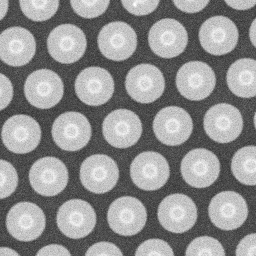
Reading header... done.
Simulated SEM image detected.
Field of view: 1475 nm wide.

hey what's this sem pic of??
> an array of small figures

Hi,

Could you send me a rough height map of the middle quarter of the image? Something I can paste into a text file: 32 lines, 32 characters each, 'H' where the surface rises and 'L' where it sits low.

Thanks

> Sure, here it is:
LLLLLLLLLLLLLLLLLLHHHHHLLLLLLLHH
LLLLLHHHHHLLLLLLLHHHHHHHLLLLLHHH
LLLLHHHHHHHHLLLLHHHHHHHHHLLLHHHH
LLLHHHHHHHHHLLLLHHHHHHHHHLLLHHHH
LLLHHHHHHHHHLLLHHHHHHHHHHLLLHHHH
LLLHHHHHHHHHLLLHHHHHHHHHHLLLHHHH
LLLHHHHHHHHHLLLLHHHHHHHHHLLLHHHH
LLLHHHHHHHHHLLLLHHHHHHHHLLLLLHHH
LLLLHHHHHHHHLLLLLHHHHHHHLLLLLLLH
LLLLLHHHHHHLLLLLLLHHHHLLLLLLLLLL
LLLLLLLLLLLLLLLLLLLLLLLLLLLLLLLL
LLLLLLLLLLLLLHHHLLLLLLLLHHHHHHLL
HHHHLLLLLLLHHHHHHHLLLLLHHHHHHHHL
HHHHHHLLLLHHHHHHHHHLLLLHHHHHHHHH
HHHHHHLLLLHHHHHHHHHLLLHHHHHHHHHH
HHHHHHHLLLHHHHHHHHHLLLHHHHHHHHHH
HHHHHHHLLLHHHHHHHHHLLLHHHHHHHHHH
HHHHHHHLLLHHHHHHHHHLLLLHHHHHHHHH
HHHHHHHLLLHHHHHHHHHLLLLHHHHHHHHL
HHHHHHLLLLLHHHHHHHLLLLLLHHHHHHLL
HHHHHLLLLLLLHHHHHLLLLLLLLLLLLLLL
HHHHLLLLLLLLLLLLLLLLLLLLLLLLLLLL
LLLLLLLLLLLLLLLLLLLHHHHHLLLLLLLH
LLLLLLHHHHHHLLLLLLHHHHHHHLLLLLHH
LLLLLHHHHHHHHLLLLHHHHHHHHHLLLHHH
LLLLHHHHHHHHHLLLLHHHHHHHHHLLLHHH
HLLLHHHHHHHHHHLLLHHHHHHHHHLLLHHH
HLLLHHHHHHHHHHLLLHHHHHHHHHLLLHHH
HLLLHHHHHHHHHHLLLHHHHHHHHHLLLLHH
HLLLHHHHHHHHHLLLLHHHHHHHHHLLLLLH
LLLLLHHHHHHHHLLLLLHHHHHHHLLLLLLL
LLLLLLHHHHHHLLLLLLLLLHHLLLLLLLLL